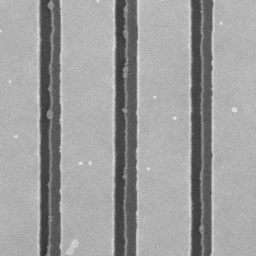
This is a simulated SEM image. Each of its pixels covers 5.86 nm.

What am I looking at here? lines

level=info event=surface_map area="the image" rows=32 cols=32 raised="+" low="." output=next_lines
+++++.+.++++++...+++++++...+++++
+++++...++++++...+++++++...+++++
+++++...++++++...+++++++...+++++
+++++...++++++...+++++++...+++++
+++++...++++++...+++++++...+++++
+++++...++++++...+++++++...+++++
+++++...++++++...+++++++...+++++
+++++...++++++...+++++++...+++++
+++++...++++++...+++++++...+++++
+++++...++++++...+++++++...+++++
+++++...++++++...+++++++...+++++
+++++...++++++...+++++++...+++++
+++++...++++++...+++++++...+++++
+++++...++++++...+++++++...+++++
+++++...++++++...+++++++...+++++
+++++...++++++...+++++++...+++++
+++++...++++++...+++++++...+++++
+++++...++++++...+++++++...+++++
+++++...++++++...+++++++...+++++
+++++...++++++...+++++++...+++++
+++++...++++++...+++++++...+++++
+++++...++++++...+++++++...+++++
+++++...++++++...+++++++...+++++
+++++...++++++...+++++++...+++++
+++++...++++++...+++++++...+++++
+++++...++++++...+++++++...+++++
+++++...++++++...+++++++...+++++
+++++...++++++...+++++++...+++++
+++++...++++++...+++++++...+++++
+++++...++++++...+++++++...+++++
+++++...++++++...+++++++...+++++
+++++...++++++...+++++++...+++++